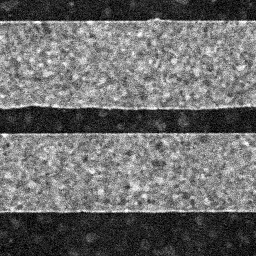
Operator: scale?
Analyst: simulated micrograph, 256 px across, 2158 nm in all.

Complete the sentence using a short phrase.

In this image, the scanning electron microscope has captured one or a few lines or trenches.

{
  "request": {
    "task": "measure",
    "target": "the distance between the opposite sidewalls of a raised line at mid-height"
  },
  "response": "679 nm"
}